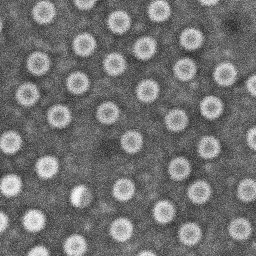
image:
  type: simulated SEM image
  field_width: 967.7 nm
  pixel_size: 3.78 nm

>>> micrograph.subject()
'a regular array of raised bodies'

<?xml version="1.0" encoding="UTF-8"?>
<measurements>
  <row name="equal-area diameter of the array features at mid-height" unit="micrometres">0.0785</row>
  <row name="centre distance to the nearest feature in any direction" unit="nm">137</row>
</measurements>